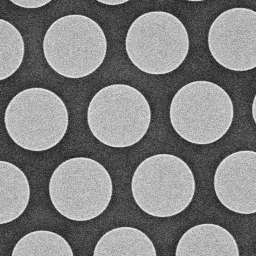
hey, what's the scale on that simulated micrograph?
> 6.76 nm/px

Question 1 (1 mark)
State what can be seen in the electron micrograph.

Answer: an array of small figures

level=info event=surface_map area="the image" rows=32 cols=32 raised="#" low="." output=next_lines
..####.......##.................
............................####
.......####......#####.....#####
##....######....#######...######
###...#######...#######...######
###...#######...########..######
###...#######...#######...######
###...#######...#######....#####
##.....#####.....#####......####
#.......##......................
........................###.....
...###......#####.....######....
..######....######....#######...
.#######...########..########...
.#######...########..########...
.#######...########...#######...
.#######....######....######....
..######....#####......####.....
...###..........................
...................###.......###
#.......####......#####.....####
###....######....#######...#####
###...########...#######...#####
####..########...#######...#####
####..########...#######...#####
###....######....#######....####
###....######.....####........##
##.......##.....................
...............##.......####....
...####......#####.....######...
..######....#######...########..
..#######...#######...########..